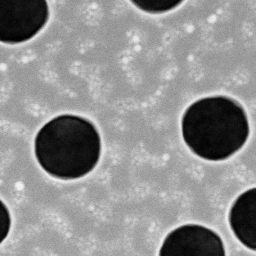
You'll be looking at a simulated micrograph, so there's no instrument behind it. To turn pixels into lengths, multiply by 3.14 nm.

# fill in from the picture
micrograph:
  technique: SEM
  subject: holes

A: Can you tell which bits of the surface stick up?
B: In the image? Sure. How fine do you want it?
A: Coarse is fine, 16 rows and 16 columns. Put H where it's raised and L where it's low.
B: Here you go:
LLLHHHHHHLLHHHHH
LLLHHHHHHHHHHHHH
LLHHHHHHHHHHHHHH
HHHHHHHHHHHHHHHH
HHHHHHHHHHHHHHHH
HHHHHHHHHHHHHHHH
HHHHHHHHHHHHLLLH
HHHLLHHHHHHLLLLH
HHLLLLHHHHHLLLLH
HHLLLLHHHHHHLLLH
HHHLLLHHHHHHHHHH
HHHHHHHHHHHHHHHH
HHHHHHHHHHHHHHHL
LHHHHHHHHHHHHHLL
LHHHHHHHHHHLLHHL
HHHHHHHHHHLLLLHH